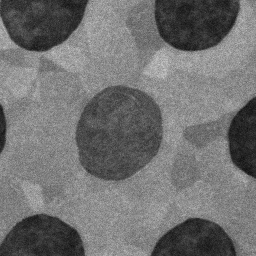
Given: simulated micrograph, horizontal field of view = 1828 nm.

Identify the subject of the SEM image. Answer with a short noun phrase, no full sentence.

holes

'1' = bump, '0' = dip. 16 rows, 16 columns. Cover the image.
0000011111000001
0000011111000001
1000111111000011
1111111111111111
1111111111111111
1111111011111111
1111100000111110
1111100000111110
1111100000111100
1111100000111100
1111100001111110
1111111111111111
1111111111111111
1101111111111111
1000011111000011
0000011111000001